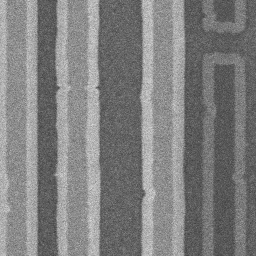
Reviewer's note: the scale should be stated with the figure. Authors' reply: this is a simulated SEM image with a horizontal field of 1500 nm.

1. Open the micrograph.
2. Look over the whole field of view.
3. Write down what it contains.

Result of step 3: one or a few lines or trenches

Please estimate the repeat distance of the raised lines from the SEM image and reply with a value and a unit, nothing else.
0.409 µm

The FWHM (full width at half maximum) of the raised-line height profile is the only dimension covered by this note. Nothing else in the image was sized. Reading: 0.179 microns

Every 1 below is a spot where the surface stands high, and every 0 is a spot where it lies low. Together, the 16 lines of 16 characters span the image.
1100110001100110
1100110001100110
1100110001100000
1100110001100000
1100110001100110
1100110001100110
1100110001100110
1100110001100110
1100110001100110
1100110001100110
1100110001100110
1100110001100110
1100110001100110
1100110001100110
1100110001100110
1100110001100110